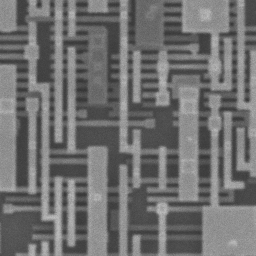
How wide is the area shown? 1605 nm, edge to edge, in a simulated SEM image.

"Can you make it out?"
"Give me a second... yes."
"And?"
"wiring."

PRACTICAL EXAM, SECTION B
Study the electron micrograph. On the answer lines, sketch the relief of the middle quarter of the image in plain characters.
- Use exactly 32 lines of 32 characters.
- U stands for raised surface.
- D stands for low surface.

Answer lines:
DUUDDDUUUUUDDDUUDUUDDDDDUUDDDDDD
DUUDDDUUUUUDDDUUDUUDDDDUUUDDDDDD
DUUDDDUUUUUDDDUUDUUDDDDDUUDDDDDD
DUUDDDUUUUUDDDUUDUUDDDDDUUDDDDDD
DUUDDDUUUUUDDDUUDUUDDDDDUUDDDDDD
DUUDDDUUUUUDDDUUDUUDDDDDUUDDDDDD
DUUDDDUUUUUDDDUUDUUDDDDDUUDDDUUU
DUUDDDUUUUUDDDUUDUUDDDDUUUDDDUUU
DUUDDDUUUUUDDDUUDUUDDDDUUUDDDUUU
DUUDDDUUUUUDDDUUDDDDDDDUUUDDDUUU
DUUDDDDDDDDDDDUUDDDDDDDDDDDDDUUU
DUUDDDDDDDDDDDUUDDDDDDDDDDDDDUUU
DUUDDDDDDDDDDDUUDDDDDDDDDDDDDUUU
DUUDDDDDDDDDDDUUDDDDDDDDDDDDDUUU
DUUDDDDDDDDDDDUUDDDDDDDDDDDDDUUU
DUUDDDDDDDDDDDUUDDDDDDDDDDDDDUUU
DUUDDDDDDDDDDDUUDDDDDDDDDDDDDUUU
DUUDDDDDDDDDDDUUDUUDDDDDDDDDDUUU
DUUDDDDDDDDDDDUUDUUDDDDDDDDDDUUU
DUUDDDDDDDDDDDUUDUUDDDDDDDDDDUUU
DUUDDDDDDDDDDDUUUUUDDDDDDDDDDUUU
DUUDDDUUUUUDDDUUUUUDDDDDUDDDDUUU
DDDDDDUUUUUDDDDDDUUDDDDDUDDDDUUU
DDDDDDUUUUUDDDDDDUUDDDDDUDDDDUUU
DDDDDDUUUUUDDDDDDUUDDDDDUDDDDUUU
DDDDDDUUUUUDDDUUDUUDDDDDUDDDDUUU
DDDDDDUUUUUDDDUUDUUDDDDDUDDDDUUU
DDDDDDUUUUUDDDUUDUUDDDDDUDDDDUUU
DDDDDDUUUUUDDDUUDUUDDDDDUDDDDUUU
DUUDDDUUUUUDDDUUDUUDDDDDUDDDDUUU
DUUDDDUUUUUDDDUUDUUDDDDDUDDDDUUU
DUUDDDUUUUUDDDUUDDDDDDDDDDDDDUUU